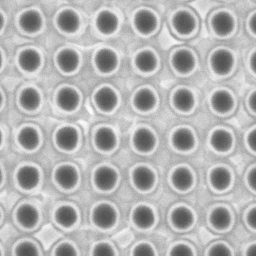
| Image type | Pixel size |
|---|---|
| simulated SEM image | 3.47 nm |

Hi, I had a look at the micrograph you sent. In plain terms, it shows a regular array of raised bodies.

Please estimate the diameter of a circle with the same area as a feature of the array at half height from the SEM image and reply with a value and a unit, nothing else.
97.5 nm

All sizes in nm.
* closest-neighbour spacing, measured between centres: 132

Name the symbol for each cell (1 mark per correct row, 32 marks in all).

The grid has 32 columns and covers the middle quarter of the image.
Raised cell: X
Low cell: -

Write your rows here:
XXXX----XXXXXX---XXXXXXX---XXXXX
XXXX----XXXXX-----XXXXX----XXXXX
XXX------XXX-------XXX------XXX-
--------------------------------
--------------------------------
XX-------XXX-----------------X--
XXXX----XXXXX-----XXXX-----XXXXX
XXXX---XXXXXXX---XXXXXX----XXXXX
XXXX---XXXXXXX---XXXXXXX---XXXXX
XXXX---XXXXXXX---XXXXXXX---XXXXX
XXXX----XXXXXX---XXXXXX----XXXXX
XXX-----XXXXX-----XXXXX-----XXXX
-----------X------------------X-
--------------------------------
--------------------------------
XXX-----XXXX-------XX---------X-
XXXX---XXXXXX----XXXXX-----XXXXX
XXXX---XXXXXX----XXXXXX----XXXXX
XXXX---XXXXXXX---XXXXXX----XXXXX
XXXX---XXXXXXX---XXXXXX----XXXXX
XXXX---XXXXXXX---XXXXXX----XXXXX
XXX-----XXXXX-----XXXXX----XXXXX
-------------------XX-----------
--------------------------------
--------------------------------
XXX------XXX-----XXXX-------XXX-
XXXX---XXXXXX----XXXXXX----XXXXX
XXXX---XXXXXXX---XXXXXX---XXXXXX
XXXX---XXXXXXX---XXXXXX---XXXXXX
XXXX---XXXXXXX---XXXXXX---XXXXXX
XXX----XXXXXX----XXXXXX----XXXXX
XX------XXXX------XXXX------XXX-